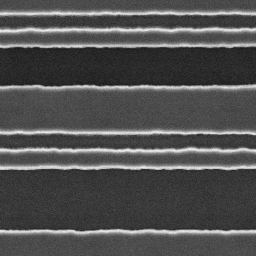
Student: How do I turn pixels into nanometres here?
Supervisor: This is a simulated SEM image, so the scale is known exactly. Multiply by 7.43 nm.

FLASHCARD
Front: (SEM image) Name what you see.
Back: lines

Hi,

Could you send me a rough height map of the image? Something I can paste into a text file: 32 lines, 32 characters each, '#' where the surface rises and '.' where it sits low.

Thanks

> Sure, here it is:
################################
################################
################################
################################
################################
################################
................................
................................
................................
................................
................................
################################
################################
################################
################################
################################
################################
################################
################################
################################
################################
................................
................................
................................
................................
................................
................................
................................
................................
################################
################################
################################